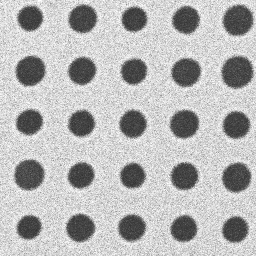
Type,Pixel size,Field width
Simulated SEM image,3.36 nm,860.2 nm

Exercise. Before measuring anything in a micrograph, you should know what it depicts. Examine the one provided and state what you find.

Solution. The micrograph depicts a regular array of holes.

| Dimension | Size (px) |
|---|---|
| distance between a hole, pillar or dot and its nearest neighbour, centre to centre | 51.5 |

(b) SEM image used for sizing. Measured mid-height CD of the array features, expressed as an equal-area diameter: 93.5 nanometers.